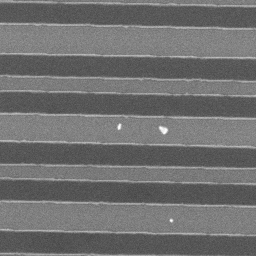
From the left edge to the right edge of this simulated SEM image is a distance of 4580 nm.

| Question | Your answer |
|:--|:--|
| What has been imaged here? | lines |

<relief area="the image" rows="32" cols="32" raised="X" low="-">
XXXXXXXXXXXXXXXX----------------
XXXXXXXXXXXXXXXXXXXXXXXXXXXXXXXX
XXXXXXXXXXXXXXXXXXXXXXXXXXXXXXXX
---------------------------XXXXX
--------------------------------
--------------------------------
--------------------------------
XXXXXXXXXXXXXXXXXXXXXXXXXXXXXXXX
XXXXXXXXXXXXXXXXXXXXXXXXXXXXXXXX
-XXXXXXXXXXXXXXXXXXXXXXXXXXXXXXX
--------------------------------
XXXXXX--------------------------
XXXXXXXXXXXXXXXXXXXXXXXXXXXXXXXX
XXXXXXXXXXXXXXXXXXXXXXXXXXXXXXXX
---------------XXXXXXXXXXXXXXXXX
--------------------------------
--------------------------------
--------------------------------
XXXXXXXXXXXXXXXXXXXXXXXXXXXXXXXX
XXXXXXXXXXXXXXXXXXXXXXXXXXXXXXXX
XXXXXXXXXXXXXXXXXXXXXXXXXXXXXXXX
--------------------------------
XXXXXX--------------------------
XXXXXXXXXXXXXXXXXXXXXXXXXXXXXXXX
XXXXXXXXXXXXXXXXXXXXXXXXXXXXXXXX
------------------XXXXXXXXXXXXXX
--------------------------------
--------------------------------
--------------------------------
XXXXXXXXXXXXXXXXXXXXXXXXXXXXXXXX
XXXXXXXXXXXXXXXXXXXXXXXXXXXXXXXX
XXXXXXXXXXXXXXXXXXXXXXXXXXXXXXXX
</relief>